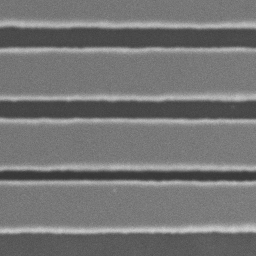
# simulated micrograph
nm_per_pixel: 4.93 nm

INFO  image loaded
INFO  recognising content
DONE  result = lines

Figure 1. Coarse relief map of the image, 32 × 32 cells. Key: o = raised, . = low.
oooooooooooooooooooooooooooooooo
oooooooooooooooooooooooooooooooo
oooooooooooooooooooooooooooooooo
......oo.....ooooooooooooooooooo
................................
................................
oooooooooooooooooooooooooooooooo
oooooooooooooooooooooooooooooooo
oooooooooooooooooooooooooooooooo
oooooooooooooooooooooooooooooooo
oooooooooooooooooooooooooooooooo
oooooooooooooooooooooooooooooooo
oooooooooooooooooooooooooooooooo
................................
................................
oooooooooooooooooooooooooooooooo
oooooooooooooooooooooooooooooooo
oooooooooooooooooooooooooooooooo
oooooooooooooooooooooooooooooooo
oooooooooooooooooooooooooooooooo
oooooooooooooooooooooooooooooooo
................................
................................
oooooooooooooooooooooooooooooooo
oooooooooooooooooooooooooooooooo
oooooooooooooooooooooooooooooooo
oooooooooooooooooooooooooooooooo
oooooooooooooooooooooooooooooooo
oooooooooooooooooooooooooooooooo
................................
................................
................................